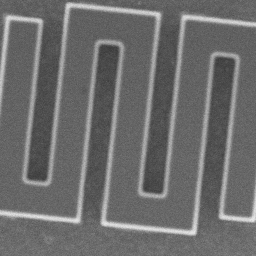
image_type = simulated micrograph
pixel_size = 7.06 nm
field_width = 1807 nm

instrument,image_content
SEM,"groups of lines, slits or small figures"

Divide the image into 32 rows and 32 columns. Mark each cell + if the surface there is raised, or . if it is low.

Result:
................................
........++++++++++..............
.+++....++++++++++++...++++.....
.++++...++++++++++++...+++++++++
.++++...++++++++++++...+++++++++
.++++...+++++.++++++...+++++++++
+++++...++++...++++...++++++++++
+++++...++++...++++...+++++...++
+++++...++++...++++...+++++...++
+++++..+++++...++++...++++...+++
++++...+++++...++++...++++...+++
++++...+++++...++++...++++...+++
++++...++++...+++++...++++...+++
++++...++++...+++++...++++...+++
++++...++++...+++++...++++...+++
++++...++++...++++...+++++...+++
++++...++++...++++...+++++...+++
++++...++++...++++...+++++...+++
+++...+++++...++++...++++...++++
+++...+++++...++++...++++...++++
+++...+++++...++++...++++...++++
+++...++++...+++++...++++...++++
++++..++++...+++++...++++...++++
++++++++++...+++++...++++...++++
++++++++++...++++++++++++...++++
++++++++++...++++++++++++...++++
++++++++++...++++++++++++...++++
........++...++++++++++++.......
.................+++++++........
................................
................................
................................